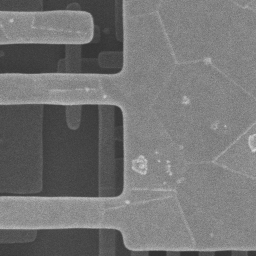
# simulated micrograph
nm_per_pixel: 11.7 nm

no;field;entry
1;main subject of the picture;wiring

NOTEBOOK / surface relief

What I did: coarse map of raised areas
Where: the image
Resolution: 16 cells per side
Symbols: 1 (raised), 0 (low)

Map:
0000000011111111
1111110011111111
1111110011111111
0000000011111111
0000000111111111
1111111111111111
0001100111111111
0000000011111111
0000000011111111
0000000011111111
0000000011111111
0000000011111111
1111111111111111
1111111111111111
0000000111111111
0000000011111111